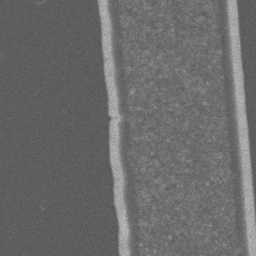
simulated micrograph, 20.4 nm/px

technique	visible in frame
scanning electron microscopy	one or a few lines or trenches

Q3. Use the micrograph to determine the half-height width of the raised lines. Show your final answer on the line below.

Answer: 2600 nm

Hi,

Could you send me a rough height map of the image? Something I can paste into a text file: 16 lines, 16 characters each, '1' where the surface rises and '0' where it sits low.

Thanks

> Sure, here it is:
0000001111111100
0000000111111110
0000000111111110
0000000111111110
0000000111111110
0000000111111110
0000000111111110
0000000111111110
0000000111111110
0000000111111110
0000000111111110
0000000111111110
0000000111111111
0000000011111111
0000000011111111
0000000011111111